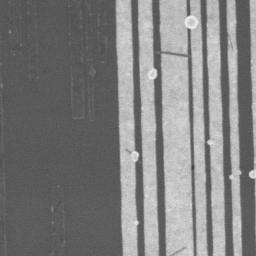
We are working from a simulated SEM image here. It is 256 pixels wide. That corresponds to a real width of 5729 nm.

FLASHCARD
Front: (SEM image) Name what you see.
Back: groups of lines, slits or small figures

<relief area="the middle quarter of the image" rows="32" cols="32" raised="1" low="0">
00111010000000111001110011111110
00111011000000111001111011111110
00111011000000111001111001111110
00111010000000111001111001111110
00111010000000111001110001111110
00111010000000111001110001111110
00111010000000111001110001111110
00111010000000111001110001111110
00111010000000111001110001111110
00111010000000111001110001111110
00111010000000111000110001111110
00111010000000111000111001111110
00111010000000111000111001111110
00000010000000111001111001111110
00000000000000111001111001111110
00000000000000111001111001111110
00000000000000111000111001111110
00000000000000111000111001111110
00000000000000111000111001111110
00000000000000111000111001111110
00000000000000111000111001111110
00000000000000111100111001111110
00000000000000111110111001111110
00000000000000111110111001111111
00000000000000111100111001111111
00000000000000111100111001111111
00000000000000111100111001111111
00000000000000111100111001111111
00000000000000111100111001111111
00000000000000111100111001111111
00000000000000111100111001111111
00000000000000111100111001111111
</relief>